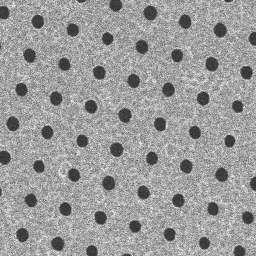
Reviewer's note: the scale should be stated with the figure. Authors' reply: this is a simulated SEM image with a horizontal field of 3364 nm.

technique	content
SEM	a regular array of holes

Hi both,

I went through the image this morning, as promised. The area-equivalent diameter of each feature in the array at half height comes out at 174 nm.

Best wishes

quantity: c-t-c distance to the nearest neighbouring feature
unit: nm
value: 460